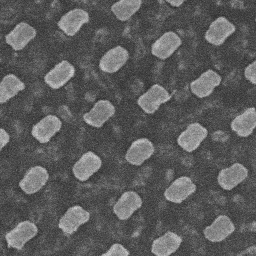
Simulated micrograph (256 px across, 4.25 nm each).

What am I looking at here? a regular array of raised bodies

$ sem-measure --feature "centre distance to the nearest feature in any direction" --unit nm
231